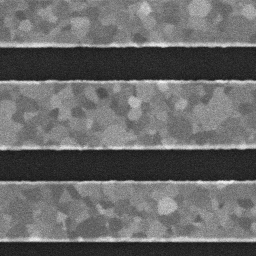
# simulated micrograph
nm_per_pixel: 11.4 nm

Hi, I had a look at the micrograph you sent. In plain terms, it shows lines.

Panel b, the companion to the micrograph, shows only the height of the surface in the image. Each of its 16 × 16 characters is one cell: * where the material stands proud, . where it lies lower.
****************
****************
****************
................
................
****************
****************
****************
****************
................
................
****************
****************
****************
****************
................